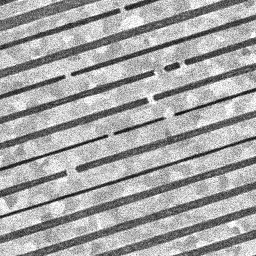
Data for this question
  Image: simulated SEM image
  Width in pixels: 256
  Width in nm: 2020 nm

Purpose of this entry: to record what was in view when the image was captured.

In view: parallel lines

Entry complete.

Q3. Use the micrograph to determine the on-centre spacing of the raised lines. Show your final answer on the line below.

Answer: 180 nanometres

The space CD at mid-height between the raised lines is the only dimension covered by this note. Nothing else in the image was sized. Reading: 0.0621 microns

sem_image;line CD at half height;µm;0.13